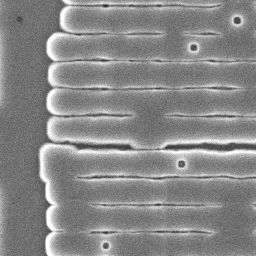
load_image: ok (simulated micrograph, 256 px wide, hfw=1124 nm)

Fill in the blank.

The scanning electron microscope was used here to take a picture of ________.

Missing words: wiring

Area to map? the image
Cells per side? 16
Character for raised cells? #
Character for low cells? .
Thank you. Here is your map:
....############
....############
...#############
...#############
...#############
...#############
...#############
...#############
...#############
...##########.##
...#############
...#############
...#############
...#############
...#############
...#############